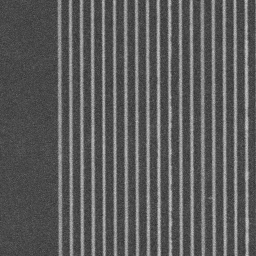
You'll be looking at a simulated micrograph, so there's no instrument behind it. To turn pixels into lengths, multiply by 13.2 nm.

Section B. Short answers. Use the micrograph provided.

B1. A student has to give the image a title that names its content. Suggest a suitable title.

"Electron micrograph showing parallel lines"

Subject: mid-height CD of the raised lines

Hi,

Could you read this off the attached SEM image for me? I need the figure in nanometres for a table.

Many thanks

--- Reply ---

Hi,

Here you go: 37.9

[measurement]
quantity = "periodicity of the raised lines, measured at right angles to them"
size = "145 nanometers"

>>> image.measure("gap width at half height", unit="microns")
0.117